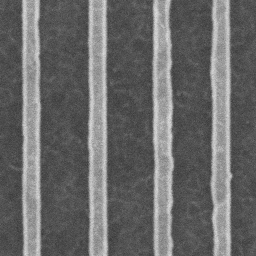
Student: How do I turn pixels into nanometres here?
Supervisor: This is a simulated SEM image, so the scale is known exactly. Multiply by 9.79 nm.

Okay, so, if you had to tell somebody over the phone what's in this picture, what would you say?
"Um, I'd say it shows one or a few lines or trenches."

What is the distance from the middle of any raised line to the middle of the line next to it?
619 nm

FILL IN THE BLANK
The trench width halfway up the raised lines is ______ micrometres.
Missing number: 0.498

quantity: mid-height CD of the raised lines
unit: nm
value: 134